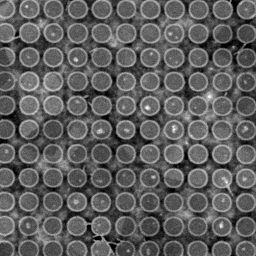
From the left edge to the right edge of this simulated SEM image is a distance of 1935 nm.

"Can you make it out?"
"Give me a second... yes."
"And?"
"a regular array of raised bodies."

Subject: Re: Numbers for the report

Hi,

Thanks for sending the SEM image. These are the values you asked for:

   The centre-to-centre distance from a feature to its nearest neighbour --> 23.9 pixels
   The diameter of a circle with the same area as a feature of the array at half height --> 144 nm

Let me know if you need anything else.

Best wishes